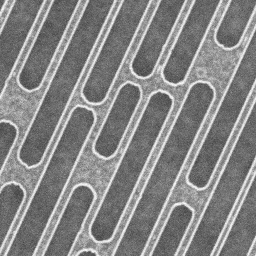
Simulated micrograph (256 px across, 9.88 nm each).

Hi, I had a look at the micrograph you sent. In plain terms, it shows parallel lines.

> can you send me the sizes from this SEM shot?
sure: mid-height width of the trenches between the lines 249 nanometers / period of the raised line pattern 0.319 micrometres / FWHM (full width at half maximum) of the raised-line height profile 7.49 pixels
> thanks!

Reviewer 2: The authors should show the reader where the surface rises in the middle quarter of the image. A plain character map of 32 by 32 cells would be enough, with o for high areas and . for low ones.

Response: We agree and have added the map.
.....oo.......ooo......oo.......
.....oo.......ooo.....ooo......o
.....o.......ooooo....ooo......o
....oo.......oooooo.ooooo.....oo
....o.......oooooooooooooo....oo
...oo.......oo.....ooooooooooooo
...oo......ooo.....oooooooooooo.
..oo.......oo......ooo....ooooo.
..ooo.....ooo......oo......ooo..
.ooooo...ooo.......oo......ooo..
.oo.oooooooo......oo.......oo...
oo.....oooo.......oo.......oo...
oo......ooo......oo.......oo....
o.......oo.......oo.......oo....
o.......oo.......o........o.....
.......ooo......oo.......oo.....
.......oo.......oo.......oo.....
......ooo......oo.......oo......
......oo.......oo......ooo......
.....ooo......oo.......oo.......
.....ooo......oo......ooo.......
.....oo......oo.......oo........
....oooo.....oo.......oo.......o
....oooooo.ooo.......oo........o
...ooooooooooo.......oo.......oo
...oooooooooo.......oo........oo
..ooooooooooo.......oo.......oo.
..oooooooooo........o........oo.
.ooooooooooo.......oo.......ooo.
.ooooooooooo.......oo.......ooo.
ooo...ooooo.......oo.......ooooo
oo.....oooo.......oo.......ooooo